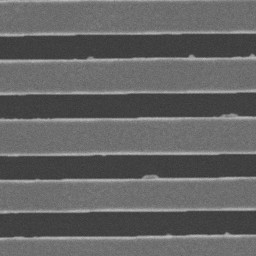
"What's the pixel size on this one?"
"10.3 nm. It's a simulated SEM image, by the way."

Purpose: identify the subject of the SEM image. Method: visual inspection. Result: lines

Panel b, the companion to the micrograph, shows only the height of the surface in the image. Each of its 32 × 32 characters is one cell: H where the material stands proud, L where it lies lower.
HHHHHHHHHHHHHHHHHHHHHHHHHHHHHHHH
HHHHHHHHHHHHHHHHHHHHHHHHHHHHHHHH
HHHHHHHHHHHHHHHHHHHHHHHHHHHHHHHH
HHHHHHHHHHHHHHHHHHHHHHHHHHHHHHHH
HHHLLLLLLLLLLLLLLLLLLLLLLLLLLLLL
LLLLLLLLLLLLLLLLLLLLLLLLLLLLLLLL
LLLLLLLLLLLLLLLLLLLLLLLLLLLLLLLL
LLLLLLLLLLLHHHHHHHHHHHHHHHHHHHHH
HHHHHHHHHHHHHHHHHHHHHHHHHHHHHHHH
HHHHHHHHHHHHHHHHHHHHHHHHHHHHHHHH
HHHHHHHHHHHHHHHHHHHHHHHHHHHHHHHH
HHHHHHHHHHHHHHHHHHHHHHHHHHHHHLLL
LLLLLLLLLLLLLLLLLLLLLLLLLLLLLLLL
LLLLLLLLLLLLLLLLLLLLLLLLLLLLLLLL
LLLLLLLLLLLLLLLLLLLLLLLLLLLLLLLL
HHHHHHHHHHHHHHHHHHHHHHHHHHHHHHHH
HHHHHHHHHHHHHHHHHHHHHHHHHHHHHHHH
HHHHHHHHHHHHHHHHHHHHHHHHHHHHHHHH
HHHHHHHHHHHHHHHHHHHHHHHHHHHHHHHH
LLLLLLLLLLLLLLLLLLLLLLLLLLLLLLLL
LLLLLLLLLLLLLLLLLLLLLLLLLLLLLLLL
LLLLLLLLLLLLLLLLLLLLLLLLLLLLLLLL
LLLLLLLHHHHHHHHHHHHHHHHHHHHHHHHH
HHHHHHHHHHHHHHHHHHHHHHHHHHHHHHHH
HHHHHHHHHHHHHHHHHHHHHHHHHHHHHHHH
HHHHHHHHHHHHHHHHHHHHHHHHHHHHHHHH
HHHHHHHHHHHLLLLLLLLLLLLLLLLLLLLL
LLLLLLLLLLLLLLLLLLLLLLLLLLLLLLLL
LLLLLLLLLLLLLLLLLLLLLLLLLLLLLLLL
LLLLLLLLLLLLLLLLLLLLLLLHHHHHHHHH
HHHHHHHHHHHHHHHHHHHHHHHHHHHHHHHH
HHHHHHHHHHHHHHHHHHHHHHHHHHHHHHHH